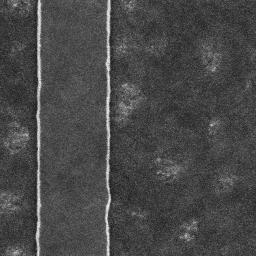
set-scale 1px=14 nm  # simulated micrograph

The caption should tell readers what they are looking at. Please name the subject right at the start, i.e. one or a few lines or trenches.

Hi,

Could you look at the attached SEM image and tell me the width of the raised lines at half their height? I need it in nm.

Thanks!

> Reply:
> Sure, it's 981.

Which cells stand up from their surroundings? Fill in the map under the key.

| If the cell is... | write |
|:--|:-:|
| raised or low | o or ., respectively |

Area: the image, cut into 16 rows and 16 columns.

..ooooo.........
..ooooo.........
..ooooo.........
..ooooo.........
..ooooo.........
..ooooo.........
..ooooo.........
..ooooo.........
..ooooo.........
..ooooo.........
..ooooo.........
..ooooo.........
..ooooo.........
..ooooo.........
..ooooo.........
..ooooo.........